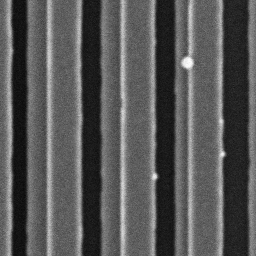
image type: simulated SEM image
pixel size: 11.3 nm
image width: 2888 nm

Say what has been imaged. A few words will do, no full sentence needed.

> lines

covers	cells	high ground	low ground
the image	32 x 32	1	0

10011111110001111110001111110001
10011111110001111110001111110001
10011111110001111110001111110001
10011111110001111110001111110001
10011111110001111110001111110001
10011111110001111110001111110001
11011111110001111110001111110001
10011111110001111110001111110001
10011111110001111110001111110001
10011111110001111110001111110001
10011111110001111110001111110001
10011111110001111110001111110001
10011111110001111110001111110001
10011111110001111110001111110001
10011111110001111110001111110001
10011111110001111110001111110001
11011111110001111110001111110001
10011111110001111110001111110001
10011111110001111110001111110001
10011111110001111110001111110001
10011111110001111110001111110001
10011111110001111110001111110001
10011111110001111110001111110001
10011111110001111110001111110001
10011111110001111110001111110001
10011111110001111110001111110001
10011111110001111110001111110001
10011111110001111110001111110001
10011111110001111110001111110001
10011111110001111110001111110001
10011111110001111110001111110001
10011111110001111110001111110001